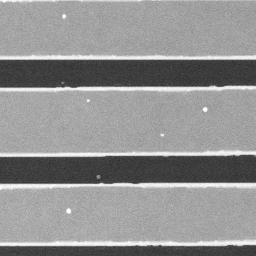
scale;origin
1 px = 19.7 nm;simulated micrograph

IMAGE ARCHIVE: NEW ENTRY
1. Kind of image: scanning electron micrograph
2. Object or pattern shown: lines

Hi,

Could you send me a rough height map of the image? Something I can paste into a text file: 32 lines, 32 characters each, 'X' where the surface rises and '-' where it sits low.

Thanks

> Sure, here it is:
XXXXXXXXXXXXXXXXXXXXXXXXXXXXXXXX
XXXXXXXXXXXXXXXXXXXXXXXXXXXXXXXX
XXXXXXXXXXXXXXXXXXXXXXXXXXXXXXXX
XXXXXXXXXXXXXXXXXXXXXXXXXXXXXXXX
XXXXXXXXXXXXXXXXXXXXXXXXXXXXXXXX
XXXXXXXXXXXXXXXXXXXXXXXXXXXXXXXX
XXXXXXXXXXXXXXXXXXXXXXXXXXXXXXXX
--------------------------------
--------------------------------
--------------------------------
--------------------------------
XXXXXXXXXXXXXXXXXXXXXXXXXXXXXXXX
XXXXXXXXXXXXXXXXXXXXXXXXXXXXXXXX
XXXXXXXXXXXXXXXXXXXXXXXXXXXXXXXX
XXXXXXXXXXXXXXXXXXXXXXXXXXXXXXXX
XXXXXXXXXXXXXXXXXXXXXXXXXXXXXXXX
XXXXXXXXXXXXXXXXXXXXXXXXXXXXXXXX
XXXXXXXXXXXXXXXXXXXXXXXXXXXXXXXX
XXXXXXXXXXXXXXXXXXXXXXXXXXXXXXXX
XXXXXXX-------------------------
--------------------------------
--------------------------------
--------------------------------
XXXXXXXXXXXXXXXXXXXXXXXXXXXXXXXX
XXXXXXXXXXXXXXXXXXXXXXXXXXXXXXXX
XXXXXXXXXXXXXXXXXXXXXXXXXXXXXXXX
XXXXXXXXXXXXXXXXXXXXXXXXXXXXXXXX
XXXXXXXXXXXXXXXXXXXXXXXXXXXXXXXX
XXXXXXXXXXXXXXXXXXXXXXXXXXXXXXXX
XXXXXXXXXXXXXXXXXXXXXXXXXXXXXXXX
XXXXXXXXXXXXXXXXXXXXXXXXXXXXXXXX
--------------------------------